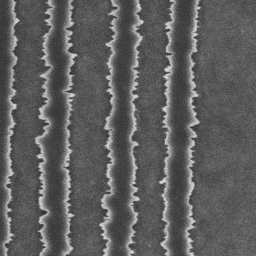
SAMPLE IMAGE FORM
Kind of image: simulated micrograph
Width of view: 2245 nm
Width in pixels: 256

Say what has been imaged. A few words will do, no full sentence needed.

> parallel lines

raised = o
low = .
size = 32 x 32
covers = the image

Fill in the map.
oo....ooo.....ooo....oooo.......
oo....ooo.....ooo....oooo.......
oo....ooo.....oooo...oooo.......
oo....ooo.....ooo....oooo.......
oo....ooo.....oooo...ooo........
oo...oooo.....ooo....oooo.......
oo....ooo.....ooo....ooo........
oo....ooo.....ooo....ooo........
oo....ooo.....ooo....ooo........
oo...oooo.....ooo....ooo........
oo....ooo.....ooo....ooo........
oo....ooo.....ooo....ooo........
o.....ooo.....ooo....ooo........
oo...oooo.....ooo....ooo........
oo...oooo.....ooo....ooo........
oo....ooo....oooo....ooo........
o.....ooo.....ooo....ooo........
o....oooo.....ooo....ooo........
o....oooo....oooo....ooo........
o....oooo.....ooo....ooo........
o....ooo......ooo....ooo........
oo...ooo.....oooo....ooo........
o....oooo.....ooo...oooo........
o....oooo.....ooo....ooo........
o....oooo....oooo...oooo........
o....ooo.....oooo....ooo........
o.....ooo....oooo....ooo........
o....oooo....oooo....ooo........
o....oooo....oooo....ooo........
o....oooo....oooo....ooo........
o....oooo....ooo....oooo........
o....oooo....ooo.....ooo........